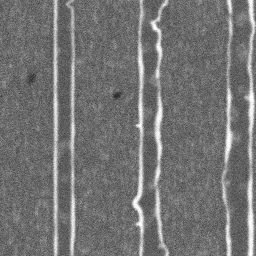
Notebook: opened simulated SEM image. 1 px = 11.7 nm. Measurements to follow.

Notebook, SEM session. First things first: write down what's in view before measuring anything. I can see one or a few lines or trenches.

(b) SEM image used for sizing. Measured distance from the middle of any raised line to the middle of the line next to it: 1.02 micrometres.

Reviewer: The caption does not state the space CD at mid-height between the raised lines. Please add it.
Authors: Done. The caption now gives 781 nm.